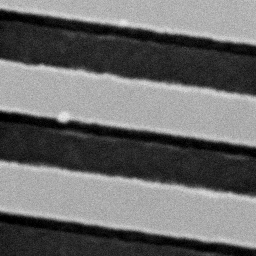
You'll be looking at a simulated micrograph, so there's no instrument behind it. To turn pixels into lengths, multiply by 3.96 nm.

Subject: lines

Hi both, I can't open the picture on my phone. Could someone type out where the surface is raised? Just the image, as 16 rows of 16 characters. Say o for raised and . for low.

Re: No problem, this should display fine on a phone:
oooooooooooooooo
......oooooooooo
.............ooo
................
oooooo..........
ooooooooooooo...
oooooooooooooooo
....oooooooooooo
...........ooooo
................
oooo............
oooooooooo......
oooooooooooooooo
..oooooooooooooo
.........ooooooo
................